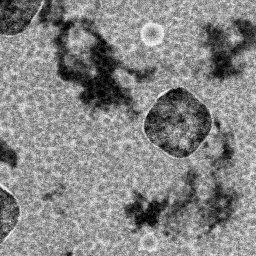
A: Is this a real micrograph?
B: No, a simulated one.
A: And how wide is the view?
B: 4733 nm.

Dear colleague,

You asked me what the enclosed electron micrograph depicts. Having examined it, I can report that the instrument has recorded holes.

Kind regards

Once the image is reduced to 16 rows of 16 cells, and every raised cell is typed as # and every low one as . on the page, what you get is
..##############
..##############
################
################
################
################
##########...###
#########....###
#########....###
##########..####
################
################
.###############
.###############
.###############
################